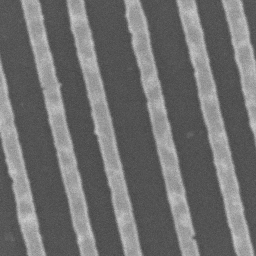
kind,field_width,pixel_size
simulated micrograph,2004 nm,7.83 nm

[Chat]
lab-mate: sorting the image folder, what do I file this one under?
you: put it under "parallel lines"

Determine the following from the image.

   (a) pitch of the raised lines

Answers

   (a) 394 nanometres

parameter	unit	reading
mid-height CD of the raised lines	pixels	14.3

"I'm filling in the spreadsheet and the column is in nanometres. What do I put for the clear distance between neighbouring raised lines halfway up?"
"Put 291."